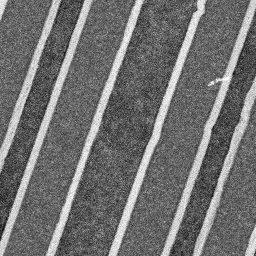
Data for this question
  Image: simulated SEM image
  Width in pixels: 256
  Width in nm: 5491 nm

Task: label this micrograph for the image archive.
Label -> one or a few lines or trenches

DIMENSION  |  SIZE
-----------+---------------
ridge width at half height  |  1030 nanometres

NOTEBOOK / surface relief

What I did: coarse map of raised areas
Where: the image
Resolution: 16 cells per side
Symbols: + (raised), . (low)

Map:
+++..++++....+++
+++..+++....+++.
+++..+++....+++.
++..+++....++++.
++..+++....+++..
++..+++....+++..
+..+++....++++..
+..+++....+++..+
+..+++....+++..+
..+++....++++.++
..+++....+++..++
..+++....+++..++
.+++....++++.+++
.+++....+++..+++
++++....+++..+++
+++....+++..++++